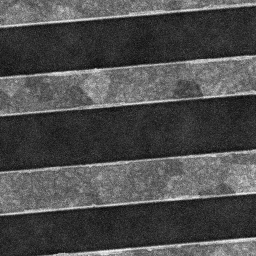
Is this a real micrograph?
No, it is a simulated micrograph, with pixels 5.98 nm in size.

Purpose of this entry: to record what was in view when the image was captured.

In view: one or a few lines or trenches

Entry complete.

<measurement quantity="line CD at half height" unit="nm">240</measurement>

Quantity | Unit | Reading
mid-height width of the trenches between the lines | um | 0.309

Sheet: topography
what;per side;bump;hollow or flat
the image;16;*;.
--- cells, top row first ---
*************...
**..............
................
................
....************
****************
********........
................
................
...............*
...*************
****************
**********......
................
................
.........*******